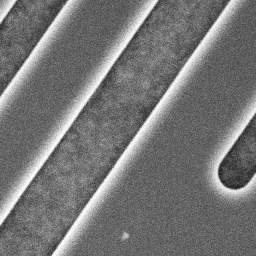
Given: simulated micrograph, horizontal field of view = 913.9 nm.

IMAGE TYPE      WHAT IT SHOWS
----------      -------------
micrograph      groups of lines, slits or small figures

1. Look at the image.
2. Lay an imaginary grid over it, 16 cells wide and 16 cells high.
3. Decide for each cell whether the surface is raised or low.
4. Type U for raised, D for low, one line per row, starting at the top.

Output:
UDDDUUUUUUDDDDUU
DDDUUUUUUDDDDUUU
DDDUUUUUDDDDDUUU
DDUUUUUDDDDDUUUU
DUUUUUUDDDDUUUUU
UUUUUUDDDDDUUUUU
UUUUUDDDDDUUUUUU
UUUUUDDDDUUUUUUU
UUUUDDDDUUUUUUUD
UUUDDDDDUUUUUUDD
UUDDDDDUUUUUUUDD
UUDDDDUUUUUUUUDU
UDDDDDUUUUUUUUUU
DDDDDUUUUUUUUUUU
DDDDUUUUUUUUUUUU
DDDDUUUUUUUUUUUU